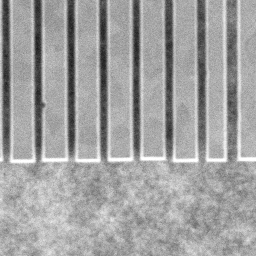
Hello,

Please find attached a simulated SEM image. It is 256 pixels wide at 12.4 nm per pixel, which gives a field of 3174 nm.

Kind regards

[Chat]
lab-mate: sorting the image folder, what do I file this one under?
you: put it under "parallel lines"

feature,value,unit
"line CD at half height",290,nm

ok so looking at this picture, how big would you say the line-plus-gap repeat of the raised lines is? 0.401 micrometres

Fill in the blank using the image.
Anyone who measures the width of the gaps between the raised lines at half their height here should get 121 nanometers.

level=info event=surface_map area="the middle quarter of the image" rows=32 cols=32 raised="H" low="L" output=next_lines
HLLHHHHHHLLHHHHHHLLHHHHHHLLLHHHH
HLLHHHHHHLLHHHHHHLLHHHHHHLLLHHHH
HLLHHHHHHLLHHHHHHLLHHHHHHLLLHHHH
HLLHHHHHHLLHHHHHHLLHHHHHHLLLHHHH
HLLHHHHHHLLHHHHHHLLHHHHHHLLLHHHH
HLLHHHHHHLLHHHHHHLLHHHHHHLLLHHHH
HLLHHHHHHLLHHHHHHLLHHHHHHLLLHHHH
HLLHHHHHHLLHHHHHHLLHHHHHHLLLHHHH
HLLHHHHHHLLHHHHHHLLHHHHHHLLLHHHH
HLLHHHHHHLLHHHHHHLLHHHHHHLLLHHHH
HLLHHHHHHLLHHHHHHLLHHHHHHLLLHHHH
HLLHHHHHHLLHHHHHHLLHHHHHHLLLHHHH
HLLHHHHHHLLHHHHHHLLHHHHHHLLLHHHH
HLLHHHHHHLLHHHHHHLLHHHHHHLLLHHHH
HLLHHHHHHLLHHHHHHLLHHHHHHLLLHHHH
HLLHHHHHHLLHHHHHHLLHHHHHHLLLHHHH
HLLHHHHHHLLHHHHHHLLHHHHHHLLLHHHH
HLLHHHHHHLLHHHHHHLLHHHHHHLLLHHHH
HLLHHHHHHLLHHHHHHLLHHHHHHLLLHHHH
HLLHHHHHHLLHHHHHHLLHHHHHHLLLHHHH
HLLHHHHHHLLHHHHHHLLHHHHHHLLLHHHH
HLLHHHHHHLLHHHHHHLLHHHHHHLLLHHHH
HLLHHHHHHLLHHHHHHLLHHHHHHLLLHHHH
HLLHHHHHHLLHHHHHHLLLHHHHHLLLHHHH
LLLLLLLLLLLLLLLLLLLLLLLLLLLLLLLL
LLLLLLLLLLLLLLLLLLLLLLLLLLLLLLLL
LLLLLLLLLLLLLLLLLLLLLLLLLLLLLLLL
LLLLLLLLLLLLLLLLLLLLLLLLLLLLLLLL
LLLLLLLLLLLLLLLLLLLLLLLLLLLLLLLL
LLLLLLLLLLLLLLLLLLLLLLLLLLLLLLLL
LLLLLLLLLLLLLLLLLLLLLLLLLLLLLLLL
LLLLLLLLLLLLLLLLLLLLLLLLLLLLLLLL